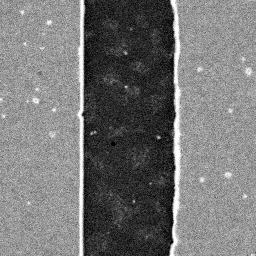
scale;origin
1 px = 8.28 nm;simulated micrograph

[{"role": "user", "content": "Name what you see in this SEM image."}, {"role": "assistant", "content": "one or a few lines or trenches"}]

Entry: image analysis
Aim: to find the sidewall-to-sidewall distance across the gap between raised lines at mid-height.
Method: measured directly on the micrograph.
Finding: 790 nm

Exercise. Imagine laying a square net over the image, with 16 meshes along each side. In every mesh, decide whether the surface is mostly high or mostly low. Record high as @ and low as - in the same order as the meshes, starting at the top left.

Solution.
@@@@@------@@@@@
@@@@@------@@@@@
@@@@@------@@@@@
@@@@@------@@@@@
@@@@@------@@@@@
@@@@@------@@@@@
@@@@@------@@@@@
@@@@@------@@@@@
@@@@@------@@@@@
@@@@@------@@@@@
@@@@@------@@@@@
@@@@@------@@@@@
@@@@@------@@@@@
@@@@@------@@@@@
@@@@@------@@@@@
@@@@@------@@@@@